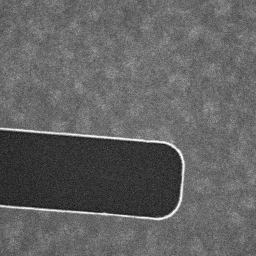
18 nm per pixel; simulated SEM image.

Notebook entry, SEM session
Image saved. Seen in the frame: one or a few lines or trenches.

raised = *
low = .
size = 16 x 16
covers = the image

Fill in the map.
****************
****************
****************
****************
****************
****************
****************
****************
......**********
...........*****
...........*****
...........*****
...........*****
********...*****
****************
****************